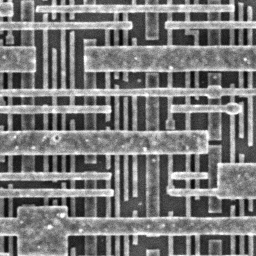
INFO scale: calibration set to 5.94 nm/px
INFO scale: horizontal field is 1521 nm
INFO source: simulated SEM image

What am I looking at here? wiring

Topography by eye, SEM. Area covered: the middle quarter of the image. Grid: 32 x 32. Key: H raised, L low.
LLLLLHHHHHHHHHHHHHHHHHHHHHHHHHHH
LLLLLHHHHHHHHHHHHHHHHHHHHHHHHHHH
LLLLLLLLLLLLLLLLLLLLLLLLLLLLLLLL
LLLLLLLLLLLLLLLLLLLLLLLLLLLLLLLL
LLLLLLLLLLLLLLLLLLLLLLLLLLLLLLLL
LLLLLLLLLLLLLLLLLLLLLLLLLLLLLLLL
HHHHHHHHHHHHHHHHHHHHHHHHHHHHHHHH
HHHHHHHHHHHHHHHHHHHHHHHHHHHHHHHH
LLLLLLLLLLLLLLLLLLLLLLLLLLLLLLLL
LLLLLLLLLLLLLLLLLLLLLLLLLLLLLLLL
LLLLLLLLLLLLLLLLLLLLLLLLLLLHHHHH
HHHHHHHHHHHHLLLLLLLLLLLLLLLHHHHH
LLLLLLLLLLLLLLLLLLLLLLLLLLLLLLLL
LLLLLLLLLLLLLLLLLLLLLLLLLLLLLLLL
LLLLLLLLLLLLLLLLLLLLLLLLLLLLLLLL
LLLLLLLLLLLLLLLLLLLLLLLLLLLLLLLL
LLLLLLLLLLLLLLLLLLLLLLLLLLLLLLLL
HHHHHHHHHHHHHHHHHHHHHHHHHHHHHHHH
HHHHHHHHHHHHHHHHHHHHHHHHHHHHHHHH
HHHHHHHHHHHHHHHHHHHHHHHHHHHHHHHH
HHHHHHHHHHHHHHHHHHHHHHHHHHHHHHHH
HHHHHHHHHHHHHHHHHHHHHHHHHHHHHHHH
HHHHHHHHHHHHHHHHHHLLLLLLLLLLLLLL
LLLLLLLLLLLLLLLLLLLLLLLLLLLLLLLL
LLLLLLLLLLLLLLLLLLLLLLLLLLLLLLLL
LLLLLLLLLLLLLLLLLLLLLLLLLLLLLLLL
LLLLLLLLLLLLLLLLLLLLLLLLLLLLLLLL
HHHHHHHHHHHHLLLLLLLLLLLLLLLHHHHH
HHHHHHHHHHHHLLLLLLLLLLLLLLLHHHHH
LLLLLLLLLLLLLLLLLLLLLLLLLLLLLLLL
LLLLLLLLLLLLLLLLLLLLLLLLLLLLLLLL
HHHHHHHHLLHHLLLLLLLLLLLLLLHHHHHH